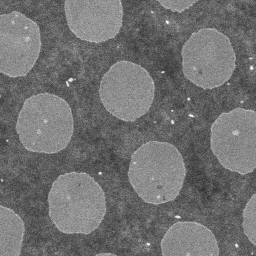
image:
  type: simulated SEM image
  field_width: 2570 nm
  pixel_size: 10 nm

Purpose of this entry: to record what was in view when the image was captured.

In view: raised bodies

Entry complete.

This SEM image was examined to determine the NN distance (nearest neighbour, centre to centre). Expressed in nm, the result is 867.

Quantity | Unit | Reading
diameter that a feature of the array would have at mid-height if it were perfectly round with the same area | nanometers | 589